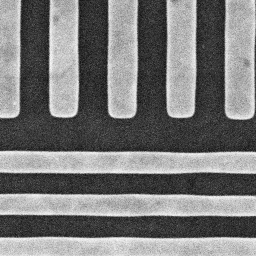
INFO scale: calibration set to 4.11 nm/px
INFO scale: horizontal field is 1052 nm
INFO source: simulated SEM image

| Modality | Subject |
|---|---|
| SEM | groups of lines, slits or small figures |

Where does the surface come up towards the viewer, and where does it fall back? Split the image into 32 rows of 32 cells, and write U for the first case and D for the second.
UUDDDDUUUUDDDDUUUDDDDUUUDDDDUUUU
UUDDDDUUUUDDDDUUUDDDDUUUDDDDUUUU
UUDDDDUUUUDDDDUUUDDDDUUUDDDDUUUU
UUDDDDUUUUDDDDUUUDDDDUUUDDDDUUUU
UUDDDDUUUUDDDDUUUDDDDUUUDDDDUUUU
UUDDDDUUUUDDDDUUUDDDDUUUDDDDUUUU
UUDDDDUUUUDDDDUUUDDDDUUUDDDDUUUU
UUDDDDUUUUDDDDUUUDDDDUUUDDDDUUUU
UUDDDDUUUUDDDDUUUDDDDUUUDDDDUUUU
UUDDDDUUUUDDDDUUUDDDDUUUDDDDUUUU
UUDDDDUUUUDDDDUUUDDDDUUUDDDDUUUU
UUDDDDUUUUDDDDUUUDDDDUUUDDDDUUUU
UUDDDDUUUUDDDDUUUDDDDUUUDDDDUUUU
UUDDDDUUUUDDDDUUUDDDDUUUDDDDUUUU
UUDDDDDUUDDDDDUUDDDDDDUUDDDDDUUD
DDDDDDDDDDDDDDDDDDDDDDDDDDDDDDDD
DDDDDDDDDDDDDDDDDDDDDDDDDDDDDDDD
DDDDDDDDDDDDDDDDDDDDDDDDDDDDDDDD
DDDDDDDDDDDDDDDDDDDDDDDDDDDDDDDD
UUUUUUUUUUUUUUUUUUUUUUUUUUUUUUUU
UUUUUUUUUUUUUUUUUUUDUUUUUUUUUUUU
DDDDDDDUUUUUUUUUUUUUUUUUDDDDUUUU
DDDDDDDDDDDDDDDDDDDDDDDDDDDDDDDD
DDDDDDDDDDDDDDDDDDDDDDDDDDDDDDDD
UUUUUUUUUUUUUUUUUUUUUUUUUDDDDDDD
UUUUUUUUUUDUUUUUUUUUUUUUUUUUUUUU
UUUUUUUUUUUUUUUUUUUUUUUUUUUUUUUU
DDDDDDDDDDDDDDDDDDDDDDDDDDDDDDDD
DDDDDDDDDDDDDDDDDDDDDDDDDDDDDDDD
DDDDDDDDDDDDDDDDDDDDDDDDDDDDDDDD
UUUUUUUUUUUUUUUUUUUUUUUUUUUUUUUU
UUUUUUUUUUUUUUUUUUUUUUUUUUUUUUUU